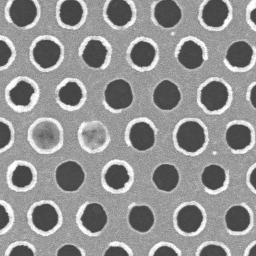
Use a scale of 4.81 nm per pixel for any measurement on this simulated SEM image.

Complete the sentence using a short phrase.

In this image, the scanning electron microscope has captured a regular array of holes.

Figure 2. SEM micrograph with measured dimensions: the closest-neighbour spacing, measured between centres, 226 nm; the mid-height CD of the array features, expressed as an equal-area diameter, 128 nm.